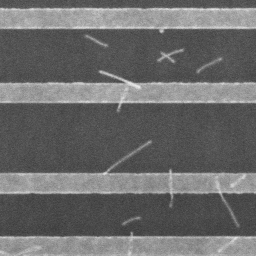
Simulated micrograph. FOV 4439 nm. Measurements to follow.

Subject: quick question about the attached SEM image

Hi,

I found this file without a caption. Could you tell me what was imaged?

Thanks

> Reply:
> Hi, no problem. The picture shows lines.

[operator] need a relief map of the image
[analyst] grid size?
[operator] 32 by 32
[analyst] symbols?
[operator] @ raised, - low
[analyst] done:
--------------------------------
@@@@@@@@@@@@@@@@@@@@@@@@@@@@@@@@
@@@@@@@@@@@@@@@@@@@@@@@@@@@@@@@@
@@@@@@@@@@@@@@@@@@@@@@@@@@@@@@@@
--------------------------------
--------------------------------
--------------------------------
--------------------------------
--------------------------------
--------------------------------
@@@@@@@@@@@@@@@@@@@@@@@@@@@@@@@@
@@@@@@@@@@@@@@@@@@@@@@@@@@@@@@@@
@@@@@@@@@@@@@@@@@@@@@@@@@@@@@@@@
--------------------------------
--------------------------------
--------------------------------
--------------------------------
--------------------------------
--------------------------------
--------------------------------
--------------------------------
--------------------------------
@@@@@@@@@@@@@@@@@@@@@@@@@@@@@@@@
@@@@@@@@@@@@@@@@@@@@@@@@@@@@@@@@
--------------------------------
--------------------------------
--------------------------------
--------------------------------
--------------------------------
--------------------------------
@@@@@@@@@@@@@@@@@@@@@@@@@@@@@@@@
@@@@@@@@@@@@@@@@@@@@@@@@@@@@@@@@